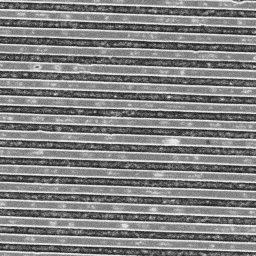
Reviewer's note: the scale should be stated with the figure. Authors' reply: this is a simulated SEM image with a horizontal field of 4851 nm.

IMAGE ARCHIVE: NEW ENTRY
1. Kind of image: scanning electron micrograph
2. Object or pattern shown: parallel lines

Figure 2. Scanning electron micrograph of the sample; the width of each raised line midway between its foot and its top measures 7.99 pixels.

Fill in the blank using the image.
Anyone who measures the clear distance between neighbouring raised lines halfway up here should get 170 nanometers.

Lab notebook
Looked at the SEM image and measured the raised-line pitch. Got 327 nanometres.